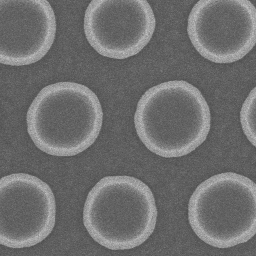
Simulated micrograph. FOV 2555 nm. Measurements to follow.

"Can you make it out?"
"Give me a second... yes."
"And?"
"raised bodies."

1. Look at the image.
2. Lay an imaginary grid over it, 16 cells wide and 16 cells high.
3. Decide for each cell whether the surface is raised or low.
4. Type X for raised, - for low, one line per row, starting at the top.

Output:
XXX---XXX---XXXX
XXX--XXXX---XXXX
XXX---XXX---XXXX
XX-----------XX-
----------------
---XX-----XX----
--XXXX---XXXX--X
--XXXX---XXXX--X
--XXXX---XXXX---
----------X-----
----------------
XXX---XXX----XXX
XXX---XXX---XXXX
XXX--XXXXX--XXXX
XXX---XXX---XXXX
----------------